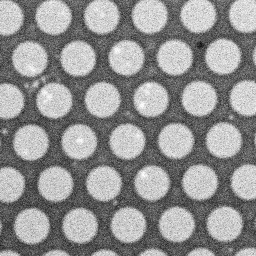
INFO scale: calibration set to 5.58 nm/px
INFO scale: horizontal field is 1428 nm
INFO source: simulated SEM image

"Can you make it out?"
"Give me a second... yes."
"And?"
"an array of small figures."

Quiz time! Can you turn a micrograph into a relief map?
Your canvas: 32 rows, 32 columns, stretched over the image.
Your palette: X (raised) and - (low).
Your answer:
XX---XXX---XXX---XXX---XXX---XXX
XXX--XXXX--XXXX--XXXX--XXXX--XXX
XXX--XXXX--XXXX--XXXX--XXXX--XXX
XX---XXX---XXX---XXX---XXX---XXX
--------------------------------
---XX----XX----XX----XX---XXX---
--XXXX--XXXX--XXXX--XXXX--XXXX--
--XXXX--XXXX--XXXX--XXXX--XXXX--
--XXXX--XXXX--XXX---XXXX--XXX---
--------------------------------
------X-----XX----XX----XX----XX
XXX--XXXX--XXXX--XXXX--XXXX--XXX
XXX--XXXX--XXXX--XXXX--XXXX--XXX
XXX--XXXX--XXXX--XXXX--XXXX--XXX
XX----XX----XX----X-------------
---------------------------X----
--XXX---XXXX--XXXX--XXXX--XXXX--
--XXXX--XXXX--XXXX--XXXX--XXXX--
--XXXX--XXXX--XXXX--XXXX--XXXX--
---XX----XX----XX----XX----XX---
--------------------------------
XX---XXX---XXX---XXXX--XXXX--XXX
XXX--XXXX--XXXX--XXXX--XXXX--XXX
XXX--XXXX--XXXX--XXXX--XXXX--XXX
XX---XXX----XX----XX----XX----XX
--------------------------------
---XX----XX----XX----XXX---XXX--
--XXXX--XXXX--XXXX--XXXX--XXXX--
--XXXX--XXXX--XXXX--XXXX--XXXX--
--XXXX--XXXX--XXXX--XXXX---XXX--
--------------------------------
XX----XX----XX----XX----XX----XX